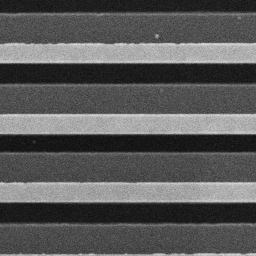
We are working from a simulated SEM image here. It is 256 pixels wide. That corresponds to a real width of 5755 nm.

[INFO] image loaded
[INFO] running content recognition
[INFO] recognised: lines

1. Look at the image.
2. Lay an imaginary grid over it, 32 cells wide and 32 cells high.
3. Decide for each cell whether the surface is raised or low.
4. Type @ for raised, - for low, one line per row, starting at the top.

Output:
--------------------------------
--------------------------------
@@@@@@@@@@@@@@@@@@@@@@@@@@@@@@@@
@@@@@@@@@@@@@@@@@@@@@@@@@@@@@@@@
@@@@@@@@@@@@@@@@@@@@@@@@@@@@@@@@
@@@@@@@@@@@@@@@@@@@@@@@@@@@@@@@@
@@@@@@@@@@@@@@@@@@@@@@@@@@@@@@@@
@@@@@@@@@@@@@@@@@@@@@@@@@@@@@@@@
--------------------------------
--------------------------------
--------------------------------
@@@@@@@@@@@@@@@@@@@@@@@@@@@@@@@@
@@@@@@@@@@@@@@@@@@@@@@@@@@@@@@@@
@@@@@@@@@@@@@@@@@@@@@@@@@@@@@@@@
@@@@@@@@@@@@@@@@@@@@@@@@@@@@@@@@
@@@@@@@@@@@@@@@@@@@@@@@@@@@@@@@@
@@@@@@@@@@@@@@@@@@@@@@@@@@@@@@@@
--------------------------------
--------------------------------
@@@@@@@@@@@@@@@@@@@@@@@@@@@@@@@@
@@@@@@@@@@@@@@@@@@@@@@@@@@@@@@@@
@@@@@@@@@@@@@@@@@@@@@@@@@@@@@@@@
@@@@@@@@@@@@@@@@@@@@@@@@@@@@@@@@
@@@@@@@@@@@@@@@@@@@@@@@@@@@@@@@@
@@@@@@@@@@@@@@@@@@@@@@@@@@@@@@@@
--------------------------------
--------------------------------
--------------------------------
@@@@@@@@@@@@@@@@@@@@@@@@@@@@@@@@
@@@@@@@@@@@@@@@@@@@@@@@@@@@@@@@@
@@@@@@@@@@@@@@@@@@@@@@@@@@@@@@@@
@@@@@@@@@@@@@@@@@@@@@@@@@@@@@@@@